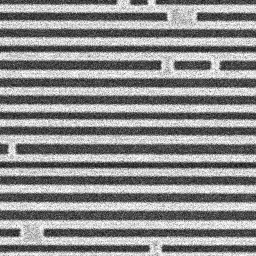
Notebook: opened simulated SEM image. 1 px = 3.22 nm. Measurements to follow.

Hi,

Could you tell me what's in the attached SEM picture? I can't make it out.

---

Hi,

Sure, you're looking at parallel lines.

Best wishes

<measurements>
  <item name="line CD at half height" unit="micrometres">0.0205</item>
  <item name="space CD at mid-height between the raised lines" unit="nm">32.2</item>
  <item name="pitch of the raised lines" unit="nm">53.6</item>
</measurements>